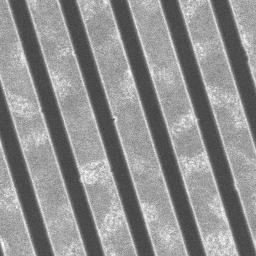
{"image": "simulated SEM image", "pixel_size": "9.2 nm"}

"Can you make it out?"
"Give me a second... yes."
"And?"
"parallel lines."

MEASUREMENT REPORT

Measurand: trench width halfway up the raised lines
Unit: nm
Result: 141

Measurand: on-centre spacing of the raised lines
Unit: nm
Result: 445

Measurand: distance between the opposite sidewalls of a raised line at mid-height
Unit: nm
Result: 297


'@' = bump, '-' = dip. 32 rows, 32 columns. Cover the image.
@--@@@@@--@@@@--@@@@--@@@@@--@@@
@@--@@@@--@@@@--@@@@---@@@@--@@@
@@--@@@@--@@@@@--@@@@--@@@@--@@@
@@--@@@@@-@@@@@--@@@@--@@@@---@@
@@--@@@@@--@@@@--@@@@---@@@@--@@
@@@--@@@@--@@@@@--@@@@--@@@@--@@
@@@--@@@@--@@@@@--@@@@--@@@@---@
@@@--@@@@@--@@@@--@@@@--@@@@@--@
@@@@--@@@@--@@@@--@@@@@--@@@@--@
@@@@--@@@@--@@@@@--@@@@--@@@@--@
@@@@--@@@@@--@@@@--@@@@--@@@@@--
@@@@@--@@@@--@@@@--@@@@@--@@@@--
-@@@@--@@@@--@@@@@--@@@@--@@@@--
-@@@@--@@@@@--@@@@--@@@@--@@@@@-
-@@@@@--@@@@--@@@@--@@@@@--@@@@-
--@@@@--@@@@--@@@@@--@@@@--@@@@-
--@@@@--@@@@@-@@@@@--@@@@--@@@@-
--@@@@--@@@@@--@@@@--@@@@---@@@@
---@@@@--@@@@--@@@@@--@@@@--@@@@
@--@@@@--@@@@--@@@@@--@@@@--@@@@
@--@@@@--@@@@@--@@@@--@@@@--@@@@
@--@@@@@--@@@@--@@@@--@@@@@--@@@
@@--@@@@--@@@@--@@@@@--@@@@--@@@
@@--@@@@--@@@@@--@@@@--@@@@--@@@
@@--@@@@@--@@@@--@@@@--@@@@@--@@
@@@--@@@@--@@@@--@@@@@--@@@@--@@
@@@--@@@@--@@@@@--@@@@--@@@@--@@
@@@--@@@@@--@@@@--@@@@--@@@@@--@
@@@@--@@@@--@@@@--@@@@@--@@@@--@
@@@@--@@@@--@@@@@--@@@@--@@@@--@
@@@@--@@@@--@@@@@--@@@@--@@@@---
@@@@---@@@@--@@@@--@@@@@--@@@@--